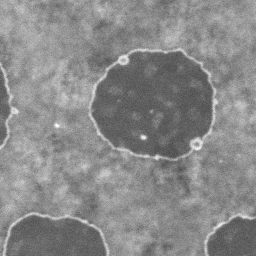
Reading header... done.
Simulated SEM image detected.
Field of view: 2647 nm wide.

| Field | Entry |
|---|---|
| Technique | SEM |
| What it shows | raised bodies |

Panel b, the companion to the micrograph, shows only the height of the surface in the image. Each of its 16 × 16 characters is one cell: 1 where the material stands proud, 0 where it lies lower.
0000000000000000
0000000000000000
0000000000000000
0000000011110000
0000000111111000
0000001111111000
1000001111111000
1000001111111000
0000001111111000
0000000011110000
0000000000000000
0000000000000000
0000000000000000
0010000000000000
0111110000000111
1111111000000111